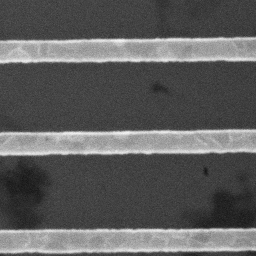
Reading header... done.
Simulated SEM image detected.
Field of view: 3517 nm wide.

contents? lines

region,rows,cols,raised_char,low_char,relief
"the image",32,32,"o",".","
................................
................................
................................
................................
................................
oooooooooooooooooooooooooooooooo
oooooooooooooooooooooooooooooooo
oooooooooooooo.ooooooooo.......o
................................
................................
................................
................................
................................
................................
................................
................................
........................oooooooo
oooooooooooooooooooooooooooooooo
oooooooooooooooooooooooooooooooo
................................
................................
................................
................................
................................
................................
................................
................................
................................
................................
oooooooooooooooooooooooooooooooo
oooooooooooooooooooooooooooooooo
oo....oo........................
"